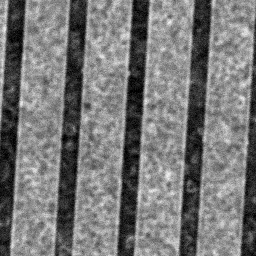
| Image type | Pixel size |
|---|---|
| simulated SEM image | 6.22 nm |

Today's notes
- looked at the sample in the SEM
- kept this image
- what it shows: one or a few lines or trenches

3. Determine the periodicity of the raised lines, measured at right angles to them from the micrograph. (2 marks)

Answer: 385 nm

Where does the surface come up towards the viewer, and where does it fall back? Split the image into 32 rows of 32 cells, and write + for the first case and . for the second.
+..++++++..+++++...+++++...+++++
+..++++++..+++++...+++++...+++++
+..+++++...+++++...+++++...+++++
+..+++++...+++++...+++++..++++++
+..+++++...+++++...+++++..++++++
...+++++...+++++...+++++..++++++
...+++++...+++++..++++++..+++++.
...+++++...+++++..++++++..+++++.
...+++++..++++++..++++++..+++++.
...+++++..++++++..++++++..+++++.
...+++++..++++++..++++++..+++++.
...+++++..++++++..+++++...+++++.
...+++++..++++++..+++++...+++++.
...+++++..++++++..+++++...+++++.
...+++++..+++++...+++++...+++++.
..++++++..+++++...+++++...+++++.
..++++++..+++++...+++++...+++++.
..++++++..+++++...+++++...+++++.
..+++++...+++++...+++++...+++++.
..+++++...+++++...+++++..++++++.
..+++++...+++++...+++++..++++++.
..+++++...+++++...+++++..++++++.
..+++++...+++++...+++++..++++++.
..+++++...+++++...+++++..+++++..
..+++++...+++++..++++++..+++++..
..+++++...+++++..++++++..+++++..
..+++++..++++++..++++++..+++++..
..+++++..++++++..+++++...+++++..
..+++++..++++++..+++++...+++++..
..+++++..++++++..+++++...+++++..
..+++++..+++++...+++++...+++++..
.++++++..+++++...+++++...+++++..